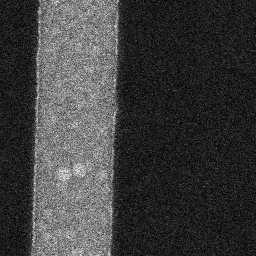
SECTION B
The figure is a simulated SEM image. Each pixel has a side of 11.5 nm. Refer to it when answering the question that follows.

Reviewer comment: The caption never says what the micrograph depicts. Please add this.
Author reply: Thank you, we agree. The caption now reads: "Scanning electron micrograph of one or a few lines or trenches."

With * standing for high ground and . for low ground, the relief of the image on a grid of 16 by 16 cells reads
***....*********
***....*********
***....*********
**.....*********
**.....*********
**.....*********
**.....*********
**.....*********
**.....*********
**.....*********
**.....*********
**.....*********
**.....*********
**.....*********
**.....*********
**.....*********